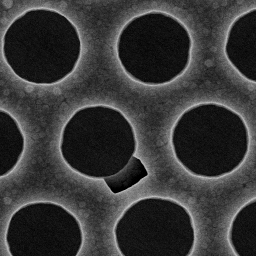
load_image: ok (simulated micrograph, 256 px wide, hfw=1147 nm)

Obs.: holes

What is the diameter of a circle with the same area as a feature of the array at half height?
335 nm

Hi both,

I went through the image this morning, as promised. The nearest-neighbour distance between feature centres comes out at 483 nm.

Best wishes